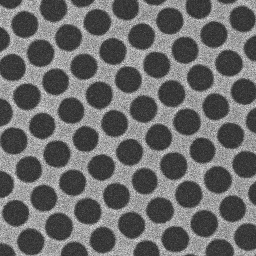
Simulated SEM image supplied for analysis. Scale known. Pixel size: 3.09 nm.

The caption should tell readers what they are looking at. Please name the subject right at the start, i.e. a regular array of holes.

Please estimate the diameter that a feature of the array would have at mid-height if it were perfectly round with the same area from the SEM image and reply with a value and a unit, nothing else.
82.5 nm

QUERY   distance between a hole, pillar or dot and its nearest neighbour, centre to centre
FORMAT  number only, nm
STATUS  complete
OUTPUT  99